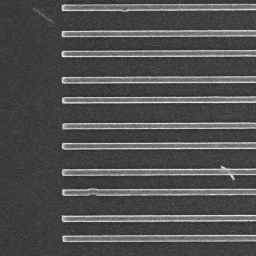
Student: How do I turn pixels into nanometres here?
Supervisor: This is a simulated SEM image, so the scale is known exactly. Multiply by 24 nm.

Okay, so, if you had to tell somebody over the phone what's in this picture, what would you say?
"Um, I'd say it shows parallel lines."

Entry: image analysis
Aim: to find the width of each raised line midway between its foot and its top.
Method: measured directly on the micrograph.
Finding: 138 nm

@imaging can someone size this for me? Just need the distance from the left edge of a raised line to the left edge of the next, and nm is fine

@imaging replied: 554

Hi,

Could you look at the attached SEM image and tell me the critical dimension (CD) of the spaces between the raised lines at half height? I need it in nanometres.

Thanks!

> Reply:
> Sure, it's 419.